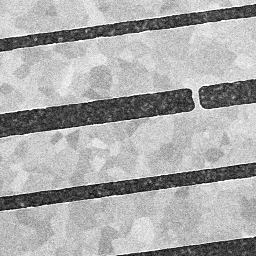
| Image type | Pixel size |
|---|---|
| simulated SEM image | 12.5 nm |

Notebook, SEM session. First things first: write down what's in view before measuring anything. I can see one or a few lines or trenches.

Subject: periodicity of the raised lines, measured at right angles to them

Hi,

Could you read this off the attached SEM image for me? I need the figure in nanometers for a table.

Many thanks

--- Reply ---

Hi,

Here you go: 1010